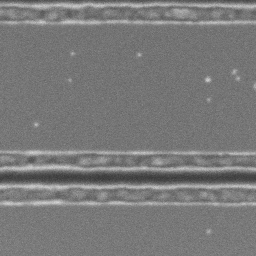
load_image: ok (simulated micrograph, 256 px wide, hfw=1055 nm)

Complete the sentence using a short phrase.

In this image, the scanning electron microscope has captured lines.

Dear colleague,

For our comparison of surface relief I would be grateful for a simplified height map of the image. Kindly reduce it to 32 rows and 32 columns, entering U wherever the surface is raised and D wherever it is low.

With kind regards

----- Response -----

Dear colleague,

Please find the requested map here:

UUUUUUUUUUUUUUUUUUUUUUUUUUUUUUUU
DDDDDDDDDDDDDDDDDDDDDDDDDDDDDDDD
DDDDDDDDDDDDDDDDDDDDDDDDDDDDDDDD
UUUUUUUUUUUUUUUUUUUUUUUUUUUUUUUU
UUUUUUUUUUUUUUUUUUUUUUUUUUUUUUUU
UUUUUUUUUUUUUUUUUUUUUUUUUUUUUUUU
UUUUUUUUUUUUUUUUUUUUUUUUUUUUUUUU
UUUUUUUUUUUUUUUUUUUUUUUUUUUUUUUU
UUUUUUUUUUUUUUUUUUUUUUUUUUUUUUUU
UUUUUUUUUUUUUUUUUUUUUUUUUUUUUUUU
UUUUUUUUUUUUUUUUUUUUUUUUUUUUUUUU
UUUUUUUUUUUUUUUUUUUUUUUUUUUUUUUU
UUUUUUUUUUUUUUUUUUUUUUUUUUUUUUUU
UUUUUUUUUUUUUUUUUUUUUUUUUUUUUUUU
UUUUUUUUUUUUUUUUUUUUUUUUUUUUUUUU
UUUUUUUUUUUUUUUUUUUUUUUUUUUUUUUU
UUUUUUUUUUUUUUUUUUUUUUUUUUUUUUUU
UUUUUUUUUUUUUUUUUUUUUUUUUUUUUUUU
UUUUUUUUUUUUUUUUUUUUUUUUUUUUUUUU
DDDDDDDDDDDDDDDDDDDDDDDDDDDDDDDD
DDDDDDDDDDDDDDDDDDDDDDDDDDDDDDDD
UUUUUUUUUUUUUUUUUUUUUUUUUUUUUUUU
UUUUUUUUUUUUUUUUUUUUUUUUUUUUUUUU
DDDDDDDDDDDDDDDDDDDDDDDDDDDDDDDD
DDDDDDDDDDDDDDDDDDDDDDDDDDDDDDDD
UUUUUUUUUUUUUUUUUUUUUUUUUUUUDDUU
UUUUUUUUUUUUUUUUUUUUUUUUUUUUUUUU
UUUUUUUUUUUUUUUUUUUUUUUUUUUUUUUU
UUUUUUUUUUUUUUUUUUUUUUUUUUUUUUUU
UUUUUUUUUUUUUUUUUUUUUUUUUUUUUUUU
UUUUUUUUUUUUUUUUUUUUUUUUUUUUUUUU
UUUUUUUUUUUUUUUUUUUUUUUUUUUUUUUU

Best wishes